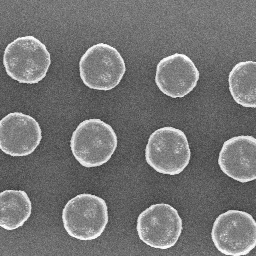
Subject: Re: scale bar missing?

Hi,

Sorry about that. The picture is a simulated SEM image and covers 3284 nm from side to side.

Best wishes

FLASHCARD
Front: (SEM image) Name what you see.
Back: raised bodies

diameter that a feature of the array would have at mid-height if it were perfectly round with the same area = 0.57 micrometres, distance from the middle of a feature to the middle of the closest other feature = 962 nm